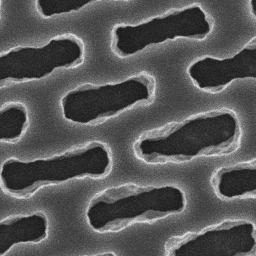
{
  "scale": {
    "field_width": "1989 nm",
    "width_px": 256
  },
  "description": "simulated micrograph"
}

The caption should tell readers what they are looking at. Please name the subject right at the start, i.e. holes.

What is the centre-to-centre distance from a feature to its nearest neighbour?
689 nm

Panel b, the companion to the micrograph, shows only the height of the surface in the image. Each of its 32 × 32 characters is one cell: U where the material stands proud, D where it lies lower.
UUUUUDDDDDDUUUUUUUUUUUUUUUUUUUUD
UUUUUDDDUUUUUUUUUUUUUUDDDUUUUUUU
UUUUUUUUUUUUUUUUUUUDDDDDDDUUUUUU
UUUUUUUUUUUUUUUDDDDDDDDDDDUUUUUU
UUUUUUUUUUUUUUUDDDDDDDUDDDUUUUUU
UUUUUUDDDDUUUUUDDDDUUUUUUUUUUUUU
UDDDDDDDDDUUUUUDDUUUUUUUUUUUUUDD
DDDDDDDDDDUUUUUUUUUUUUUUUDDDDDDD
DDDDDDDUUUUUUUUUUUUUUUUUDDDDDDDD
DDDDDDUUUUUUUUUUUUUUUUUUDDDDDDDD
UUUUUUUUUUUUUUUDDDDUUUUUUDDDUUUU
UUUUUUUUUDDDDDDDDDDUUUUUUUUUUUUU
UUUUUUUUDDDDDDDDDUUUUUUUUUUUUUUU
UDDUUUUUDDDDDDDDUUUUUUUUUUUUUUUU
DDDUUUUUDDDDDDUUUUUUUUUUUDDDDUUU
DDDUUUUUUUUUUUUUUUUUUUDDDDDDDDUU
DDDUUUUUUUUUUUUUUUUUUDDDDDDDDUUU
UUUUUUUUUUUUUUUUUUDDDDDDDDDDDUUU
UUUUUUUUUUUDDUUUUUDDDDDDDDDDUUUU
UUUUUUUDDDDDDUUUUUDDDDDDUUUUUUUU
UDDDDDDDDDDDDUUUUUUUUUUUUUUUUUUU
DDDDDDDDDDDDDUUUUUUUUUUUUUUUDDDD
DDDDDDDDUUUUUUUUUUUUUUUUUUUDDDDD
UDDDUUUUUUUUUUUUUUDDDDUUUUUDDDDD
UUUUUUUUUUUUUDDDDDDDDDDUUUUUDDUU
UUUUUUUUUUUDDDDDDDDDDDDUUUUUUUUU
UUUUUUUUUUUDDDDDDDDDDDUUUUUUUUUU
UDDDDDUUUUUDDDDDUUUUUUUUUUUUUUUU
DDDDDDUUUUUUDUUUUUUUUUUUUUUDDDDD
DDDDDDUUUUUUUUUUUUUUUUUUDDDDDDDD
DDUUUUUUUUUUUUUUUUUUUUUDDDDDDDDD
DUUUUUUUUUUUUUUUUUUUUUDDDDDDDDDD